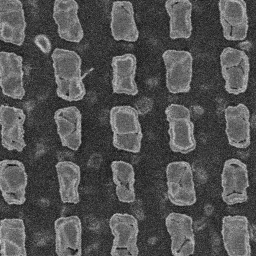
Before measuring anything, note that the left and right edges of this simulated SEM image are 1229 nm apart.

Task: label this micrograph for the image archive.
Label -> a regular array of raised bodies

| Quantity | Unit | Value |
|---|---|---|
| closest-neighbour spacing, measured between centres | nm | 259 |